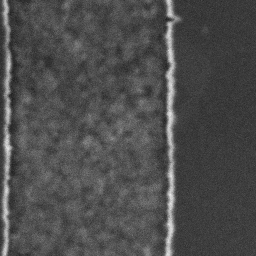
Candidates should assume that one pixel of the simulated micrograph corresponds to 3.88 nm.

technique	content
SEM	one or a few lines or trenches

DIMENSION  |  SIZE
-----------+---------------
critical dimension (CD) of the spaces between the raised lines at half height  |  0.627 microns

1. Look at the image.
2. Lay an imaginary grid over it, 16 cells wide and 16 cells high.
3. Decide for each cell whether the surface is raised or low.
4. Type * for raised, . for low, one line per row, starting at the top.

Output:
...........*****
...........*****
...........*****
*..........*****
*..........*****
...........*****
*..........*****
*..........*****
...........*****
*..........*****
...........*****
...........*****
...........*****
...........*****
...........*****
..........******